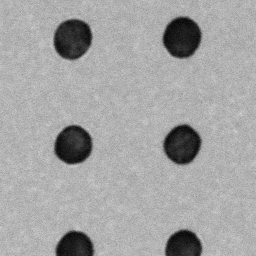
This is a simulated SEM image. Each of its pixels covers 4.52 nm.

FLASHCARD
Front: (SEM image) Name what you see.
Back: holes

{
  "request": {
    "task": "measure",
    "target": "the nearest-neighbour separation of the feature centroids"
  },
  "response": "481 nanometers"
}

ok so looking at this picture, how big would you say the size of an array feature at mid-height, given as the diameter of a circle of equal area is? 40.6 pixels